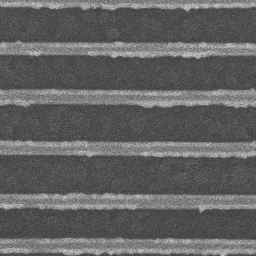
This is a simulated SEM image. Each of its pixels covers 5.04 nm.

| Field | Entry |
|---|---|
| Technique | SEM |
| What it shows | parallel lines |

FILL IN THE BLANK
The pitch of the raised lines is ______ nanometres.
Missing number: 249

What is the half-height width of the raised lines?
70.6 nanometers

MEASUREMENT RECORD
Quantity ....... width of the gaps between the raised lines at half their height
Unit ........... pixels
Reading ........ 35.3